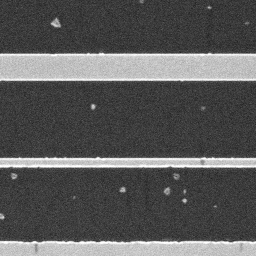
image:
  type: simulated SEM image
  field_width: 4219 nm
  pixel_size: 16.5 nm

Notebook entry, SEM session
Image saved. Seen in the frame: lines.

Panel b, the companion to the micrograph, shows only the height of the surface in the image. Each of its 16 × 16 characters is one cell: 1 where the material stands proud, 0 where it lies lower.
0000000000000000
0000000000000000
0000000000000000
1111111111111111
1111111111111111
0000000000000000
0000000000000000
0000000000000000
0000000000000000
0000000000000000
0000000000000000
0000000000000000
0000000000000000
0000000000000000
0000000000000000
1111111111111111